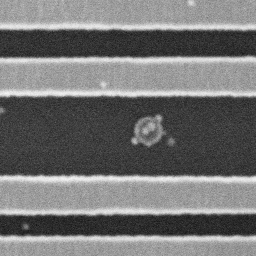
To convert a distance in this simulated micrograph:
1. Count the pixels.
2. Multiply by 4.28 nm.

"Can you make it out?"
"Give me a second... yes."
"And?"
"lines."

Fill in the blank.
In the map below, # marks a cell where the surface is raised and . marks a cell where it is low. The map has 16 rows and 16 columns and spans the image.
################
################
................
................
################
################
................
................
................
................
................
################
################
................
................
################